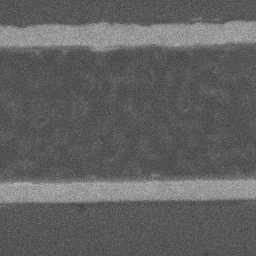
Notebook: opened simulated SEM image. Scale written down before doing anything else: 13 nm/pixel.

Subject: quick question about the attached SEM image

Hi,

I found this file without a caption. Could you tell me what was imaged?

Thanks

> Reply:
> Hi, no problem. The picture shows one or a few lines or trenches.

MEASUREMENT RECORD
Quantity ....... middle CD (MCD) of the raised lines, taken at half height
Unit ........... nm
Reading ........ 1990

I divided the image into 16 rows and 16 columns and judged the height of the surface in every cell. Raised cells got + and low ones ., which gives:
................
................
++++++++++++++++
++++++++++++++++
++++++++++++++++
++++++++++++++++
++++++++++++++++
++++++++++++++++
++++++++++++++++
++++++++++++++++
++++++++++++++++
++++++++++++++++
................
................
................
................